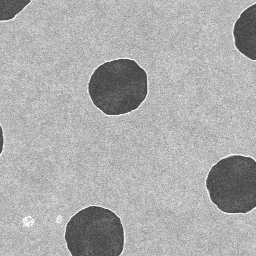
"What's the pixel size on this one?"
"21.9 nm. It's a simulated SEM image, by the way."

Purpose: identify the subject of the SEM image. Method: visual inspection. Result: holes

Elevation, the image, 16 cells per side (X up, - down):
-XXXXXXXXXXXXXXX
XXXXXXXXXXXXXXX-
XXXXXXXXXXXXXXX-
XXXXXXXXXXXXXXX-
XXXXXX---XXXXXXX
XXXXXX---XXXXXXX
XXXXXX---XXXXXXX
XXXXXXXXXXXXXXXX
XXXXXXXXXXXXXXXX
XXXXXXXXXXXXXXXX
XXXXXXXXXXXXX---
XXXXXXXXXXXXX---
XXXXXXXXXXXXX---
XXXXX--XXXXXXXXX
XXXX----XXXXXXXX
XXXX----XXXXXXXX